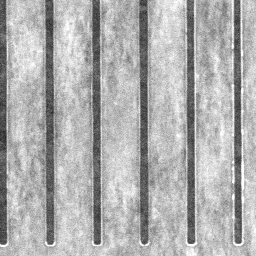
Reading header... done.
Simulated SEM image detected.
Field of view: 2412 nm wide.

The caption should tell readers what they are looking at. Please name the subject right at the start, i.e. parallel lines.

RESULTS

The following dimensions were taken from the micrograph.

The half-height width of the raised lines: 91.8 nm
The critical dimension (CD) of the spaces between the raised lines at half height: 0.351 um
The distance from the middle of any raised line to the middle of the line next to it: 442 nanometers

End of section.